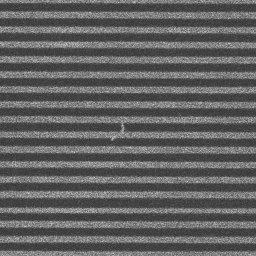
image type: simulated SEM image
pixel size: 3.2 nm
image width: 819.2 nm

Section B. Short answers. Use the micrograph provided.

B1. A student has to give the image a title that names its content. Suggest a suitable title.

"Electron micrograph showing parallel lines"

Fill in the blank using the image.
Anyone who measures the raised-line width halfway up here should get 21.6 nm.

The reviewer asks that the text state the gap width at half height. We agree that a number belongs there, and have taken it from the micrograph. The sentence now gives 24.4 nm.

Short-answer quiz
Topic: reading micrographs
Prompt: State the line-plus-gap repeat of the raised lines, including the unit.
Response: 47.9 nm